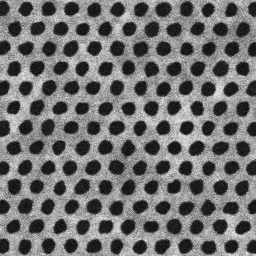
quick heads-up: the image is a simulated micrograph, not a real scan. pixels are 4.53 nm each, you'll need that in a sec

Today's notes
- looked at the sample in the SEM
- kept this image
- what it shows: a regular array of holes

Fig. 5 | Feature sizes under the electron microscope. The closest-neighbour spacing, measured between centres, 100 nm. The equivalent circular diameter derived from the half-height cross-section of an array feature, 64.1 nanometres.